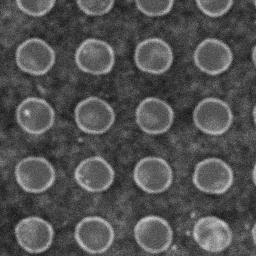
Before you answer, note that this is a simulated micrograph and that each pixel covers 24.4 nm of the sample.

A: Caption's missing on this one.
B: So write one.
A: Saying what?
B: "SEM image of a regular array of raised bodies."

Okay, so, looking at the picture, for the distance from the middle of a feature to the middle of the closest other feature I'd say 1430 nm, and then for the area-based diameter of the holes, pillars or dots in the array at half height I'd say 859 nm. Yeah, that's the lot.